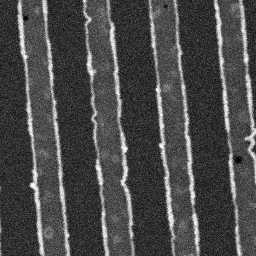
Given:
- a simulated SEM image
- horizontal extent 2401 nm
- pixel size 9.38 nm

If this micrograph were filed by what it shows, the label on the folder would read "one or a few lines or trenches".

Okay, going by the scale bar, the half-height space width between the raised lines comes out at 23.3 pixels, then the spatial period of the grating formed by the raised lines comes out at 614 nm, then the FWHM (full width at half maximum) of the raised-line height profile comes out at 0.396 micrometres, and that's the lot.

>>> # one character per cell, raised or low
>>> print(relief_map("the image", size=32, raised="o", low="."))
ooo..oooooo...ooooo...ooooo...oo
ooo...ooooo...ooooo...ooooo...oo
ooo...ooooo...ooooo...ooooo...oo
ooo...ooooo...ooooo...oooooo..oo
ooo...ooooo...ooooo...oooooo..oo
ooo...ooooo...ooooo...oooooo...o
ooo...ooooo...ooooo...oooooo...o
ooo...ooooo...oooooo..oooooo...o
ooo...ooooo...oooooo...ooooo...o
ooo...oooooo..oooooo...ooooo...o
ooo...oooooo...ooooo...ooooo...o
oooo...ooooo...ooooo...ooooo...o
oooo...ooooo...ooooo...ooooo...o
oooo...ooooo...ooooo...ooooo...o
oooo...ooooo...ooooo...ooooo...o
oooo...ooooo...ooooo...oooooo..o
oooo...ooooo...ooooo...oooooo...
oooo...ooooo...ooooo...oooooo..o
oooo...ooooo...oooooo..oooooo..o
oooo...ooooo...oooooo...ooooo...
oooo...ooooo...oooooo...ooooo...
ooooo..oooooo...ooooo...ooooo...
ooooo..oooooo..oooooo...ooooo...
ooooo...ooooo...ooooo...ooooo...
ooooo...ooooo...ooooo...ooooo...
ooooo...ooooo...ooooo...ooooo...
ooooo...ooooo...ooooo...oooooo..
ooooo...ooooo...oooooo..oooooo..
ooooo...ooooo...oooooo..oooooo..
ooooo...ooooo...oooooo..oooooo..
ooooo...ooooo....ooooo...ooooo..
ooooo...ooooo....ooooo...ooooo..